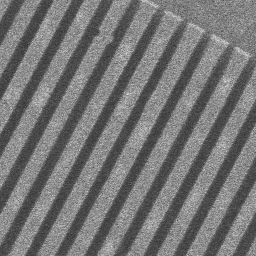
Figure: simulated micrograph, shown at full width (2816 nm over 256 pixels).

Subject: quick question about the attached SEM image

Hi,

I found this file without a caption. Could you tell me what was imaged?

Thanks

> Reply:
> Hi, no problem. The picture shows parallel lines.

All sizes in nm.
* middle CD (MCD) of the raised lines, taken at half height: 172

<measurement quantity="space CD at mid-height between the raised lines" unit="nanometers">118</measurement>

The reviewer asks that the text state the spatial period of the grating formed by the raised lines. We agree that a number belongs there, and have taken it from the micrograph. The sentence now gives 287 nanometers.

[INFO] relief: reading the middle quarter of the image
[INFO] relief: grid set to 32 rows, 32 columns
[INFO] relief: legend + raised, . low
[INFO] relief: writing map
....++++...++++...+++++...++++..
...++++....++++...++++...+++++..
...++++...++++...+++++...++++...
..++++....++++...++++...+++++...
.+++++...++++...+++++...++++...+
.++++...+++++...++++...+++++...+
.++++...++++...+++++...++++...++
++++...+++++...++++...+++++...++
++++...++++...+++++..+++++...+++
+++...+++++...++++...++++....+++
+++...++++...+++++..+++++...++++
++...+++++..+++++...++++...+++++
++...++++...+++++..+++++...++++.
+...+++++..+++++...++++...+++++.
....++++...++++...+++++...++++..
...++++...+++++...++++...+++++..
...++++...++++...+++++...++++...
..++++...+++++...++++...+++++...
..++++...++++...+++++...++++...+
.++++...+++++...++++...+++++...+
+++++...++++...+++++...++++...++
++++...+++++...++++...++++....++
++++...++++...++++....++++...+++
+++...+++++...++++...++++....+++
+++...++++...+++++...++++...++++
++...+++++...++++...++++....++++
++...++++...++++....++++...++++.
+...+++++..+++++...++++...+++++.
+..+++++...++++...+++++...++++..
...+++++..+++++...++++...+++++..
..+++++...++++...+++++...++++...
..++++...+++++...++++...+++++...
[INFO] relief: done